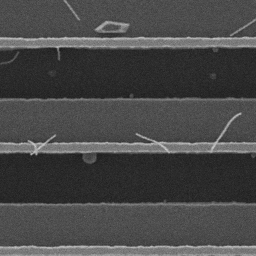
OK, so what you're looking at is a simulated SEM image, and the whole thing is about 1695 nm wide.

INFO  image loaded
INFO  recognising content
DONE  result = lines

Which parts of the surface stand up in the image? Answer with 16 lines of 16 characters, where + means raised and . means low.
++++++++++++++++
++++++++++++++++
++++++++++++++++
................
................
................
++++++++++++++++
++++++++++++++++
++++++++++++++++
++++++.+..++++++
................
................
................
++++++++++++++++
++++++++++++++++
++++++++++++++++